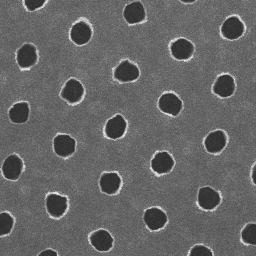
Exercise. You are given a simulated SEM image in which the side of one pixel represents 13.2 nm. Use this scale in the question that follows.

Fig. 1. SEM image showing a regular array of holes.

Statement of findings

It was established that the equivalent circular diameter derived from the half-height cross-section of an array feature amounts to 284 nm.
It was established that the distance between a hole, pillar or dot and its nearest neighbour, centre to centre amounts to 735 nanometres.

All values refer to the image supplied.